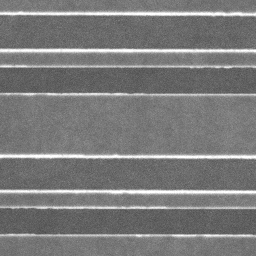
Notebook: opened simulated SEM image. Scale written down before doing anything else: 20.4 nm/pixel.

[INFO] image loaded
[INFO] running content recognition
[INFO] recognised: lines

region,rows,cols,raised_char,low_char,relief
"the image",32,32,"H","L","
HHHHHHHHHHHHHHHHHHHHHHHHHHHHHHHH
HHHHHHHHHHHHHHHHHHHHHHHHHHHHHHHH
LLLLLLLLLLLLLLLLLLLLLLLLLLLLLLLL
LLLLLLLLLLLLLLLLLLLLLLLLLLLLLLLL
LLLLLLLLLLLLLLLLLLLLLLLLLLLLLLLL
LLLLLLLLLLLLLLLLLLLLLLLLLLLLLLLL
HHHHHHHHHHHHHHHHHHHHHHHHHHHHHHHH
HHHHHHHHHHHHHHHHHHHHHHHHHHHHHHHH
LLLLLLLLLLLLLLLLLLLLLLLLLLLLLLLL
LLLLLLLLLLLLLLLLLLLLLLLLLLLLLLLL
LLLLLLLLLLLLLLLLLLLLLLLLLLLLLLLL
LLLLLLLLLLLLLLLLLLLLLLLLLLLLLLLL
HHHHHHHHHHHHHHHHHHHHHHHHHHHHHHHH
HHHHHHHHHHHHHHHHHHHHHHHHHHHHHHHH
HHHHHHHHHHHHHHHHHHHHHHHHHHHHHHHH
HHHHHHHHHHHHHHHHHHHHHHHHHHHHHHHH
HHHHHHHHHHHHHHHHHHHHHHHHHHHHHHHH
HHHHHHHHHHHHHHHHHHHHHHHHHHHHHHHH
HHHHHHHHHHHHHHHHHHHHHHHHHHHHHHHH
LLLLLLLLLLLLLLLLLLLLLLLLLLLLLLLH
LLLLLLLLLLLLLLLLLLLLLLLLLLLLLLLL
LLLLLLLLLLLLLLLLLLLLLLLLLLLLLLLL
LLLLLLLLLLLLLLLLLLLLLLLLLLLLLLLL
LLLLLLLLLLLLLLLLLLLLLLLLLLLLLLLL
HHHHHHHHHHHHHHHHHHHHHHHHHHHHHHHH
HHHHHHHHHHHHHHHHHHHHHHHHHHHHHHHH
LLLLLLLLLLLLLLLLLLLLLLLLLLLLLLLL
LLLLLLLLLLLLLLLLLLLLLLLLLLLLLLLL
LLLLLLLLLLLLLLLLLLLLLLLLLLLLLLLL
HHHHHHHHHHHHHHHHHHHHHHHHHHHHHLHL
HHHHHHHHHHHHHHHHHHHHHHHHHHHHHHHH
HHHHHHHHHHHHHHHHHHHHHHHHHHHHHHHH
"